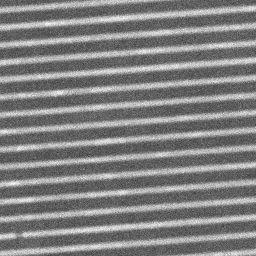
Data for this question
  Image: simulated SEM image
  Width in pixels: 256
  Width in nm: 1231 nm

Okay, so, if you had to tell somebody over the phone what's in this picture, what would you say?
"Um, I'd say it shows parallel lines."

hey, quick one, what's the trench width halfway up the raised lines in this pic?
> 61.1 nm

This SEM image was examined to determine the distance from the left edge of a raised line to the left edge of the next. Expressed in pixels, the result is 17.4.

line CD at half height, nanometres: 20.4